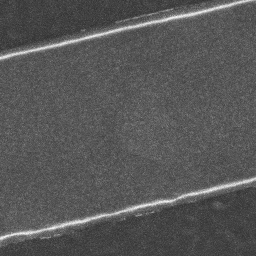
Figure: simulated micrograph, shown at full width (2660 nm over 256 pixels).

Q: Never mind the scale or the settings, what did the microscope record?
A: one or a few lines or trenches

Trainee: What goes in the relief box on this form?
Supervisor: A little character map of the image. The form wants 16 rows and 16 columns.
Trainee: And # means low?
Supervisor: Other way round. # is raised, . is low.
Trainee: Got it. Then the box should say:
..............##
.........#######
.....###########
.###############
################
################
################
################
################
################
################
###############.
###########.....
######..........
##..............
................